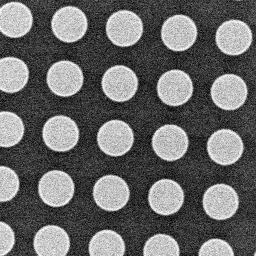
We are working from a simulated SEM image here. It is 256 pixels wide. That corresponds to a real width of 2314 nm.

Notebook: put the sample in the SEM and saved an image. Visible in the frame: an array of small figures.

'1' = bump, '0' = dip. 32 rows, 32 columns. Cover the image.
01100000000000000000000000000000
11110001110000010000000000000000
11110001111000111000011100000000
11110001111001111100111100011110
01100001110000111100111100011110
00000000000000010000011100011110
00000000000000000000000000001100
11000000000000000000000000000000
11100011110000110000000000000000
11100011110001111000111000001000
11100011110001111000111100011110
00000001100001111000111100111110
00000000000000110000111000011110
00000000000000000000000000001000
11000000000000000000000000000000
11100011100001110000000000000000
11100111110011110000111000011000
11000011110011111001111000111100
00000011100001110001111000111100
00000000000000000000111000111100
00000000000000000000000000011000
11000011000000000000000000000000
11000111100011100000100000000000
11000111100011110001111000111000
11000111100011110001111000111100
00000011000011110001111001111100
00000000000000000000110000111000
00000000000000000000000000000000
10000111000000000000000000000000
11001111000011100001100000000000
11001111100111100011110000110000
10000111000111100011110001111000